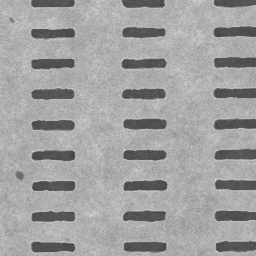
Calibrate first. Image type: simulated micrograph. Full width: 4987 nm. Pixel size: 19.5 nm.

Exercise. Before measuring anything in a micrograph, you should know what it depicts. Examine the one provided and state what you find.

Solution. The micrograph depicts a regular array of holes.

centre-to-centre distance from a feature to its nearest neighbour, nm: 588